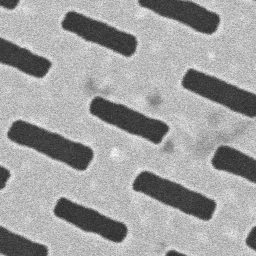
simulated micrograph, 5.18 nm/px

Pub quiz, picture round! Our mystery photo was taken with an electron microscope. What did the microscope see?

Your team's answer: holes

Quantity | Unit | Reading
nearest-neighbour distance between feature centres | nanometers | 443